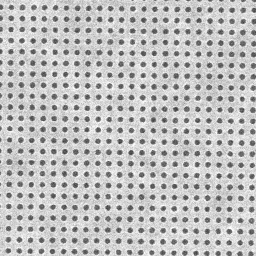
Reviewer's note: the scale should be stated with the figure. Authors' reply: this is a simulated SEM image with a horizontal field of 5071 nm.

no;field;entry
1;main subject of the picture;a regular array of holes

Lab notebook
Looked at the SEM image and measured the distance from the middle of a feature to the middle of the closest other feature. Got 214 nm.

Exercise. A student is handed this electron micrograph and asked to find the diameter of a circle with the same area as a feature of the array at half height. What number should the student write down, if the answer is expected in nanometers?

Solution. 116